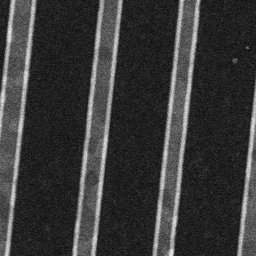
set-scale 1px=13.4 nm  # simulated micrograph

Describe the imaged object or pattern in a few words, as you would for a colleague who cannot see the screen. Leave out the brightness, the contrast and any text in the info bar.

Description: one or a few lines or trenches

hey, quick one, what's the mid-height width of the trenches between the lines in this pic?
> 894 nanometres